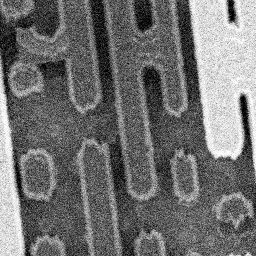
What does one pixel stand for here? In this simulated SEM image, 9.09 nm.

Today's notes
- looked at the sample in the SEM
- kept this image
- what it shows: parallel lines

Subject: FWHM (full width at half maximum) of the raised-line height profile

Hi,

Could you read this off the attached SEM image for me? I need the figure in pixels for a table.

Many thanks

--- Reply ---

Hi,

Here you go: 27.6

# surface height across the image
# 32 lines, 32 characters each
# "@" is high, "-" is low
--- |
@@@@---@@@@--@@@---@@@--@@@@--@@
@@@-----@@@--@@@@--@@@--@@@@--@@
--------@@@--@@@@--@@@--@@@@--@@
--------@@@---@@@--@@@--@@@@@@@@
--@@@--@@@@@--@@@@@@@@--@@@@@@@@
--@@@@@@@@@@--@@@@@@@@---@@@@@@@
--@@@@@@@@@@--@@@@@@@@---@@@@@@@
--@@@@@@@@@@--@@@@@@@@@--@@@@@@@
--@@@---@@@@--@@@@--@@@--@@@@@@@
-@@@@----@@@--@@@@--@@@--@@@@@@@
-@@@@----@@@--@@@@--@@@--@@@@@@@
--@------@@@---@@@--@@@--@@@@@@@
---------@@@---@@@---@@---@@@@-@
@---------@----@@@---@@---@@@@-@
@--------------@@@--------@@@@-@
@--------------@@@--------@@@@-@
@--------------@@@--------@@@@--
@--------------@@@@-------@@@@--
@---------@@@--@@@@-------@@@@--
@--@@@----@@@---@@@---@---------
@--@@@----@@@@--@@@---@@--------
@@-@@@@---@@@@--@@@---@@--------
@@-@@@@---@@@@--@@@---@@--------
@@-@@@----@@@@--@@@---@@@-------
@@--@@-----@@@---@@---@@@----@--
@@---------@@@--------------@@@-
@@---------@@@-------------@@@@-
@@---------@@@---------------@--
@@---------@@@@-----------------
@@@--------@@@@---@@------------
@@@--@@----@@@@--@@@------------
@@@-@@@@---@@@@--@@@------------